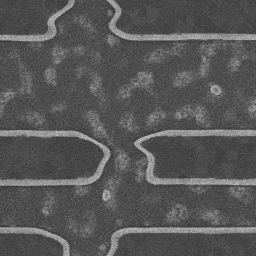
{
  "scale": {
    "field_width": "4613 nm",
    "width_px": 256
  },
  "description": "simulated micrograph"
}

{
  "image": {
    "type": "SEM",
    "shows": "one or a few lines or trenches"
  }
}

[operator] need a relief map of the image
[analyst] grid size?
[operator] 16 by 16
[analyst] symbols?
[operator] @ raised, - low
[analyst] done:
@@@@---@@@@@@@@@
@@@----@@@@@@@@@
----------------
----------------
----------------
----------------
----------------
----------------
@@@@@----@@@@@@@
@@@@@@@--@@@@@@@
@@@@@@---@@@@@@@
----------------
----------------
----------------
@@@-----@@@@@@@@
@@@@---@@@@@@@@@